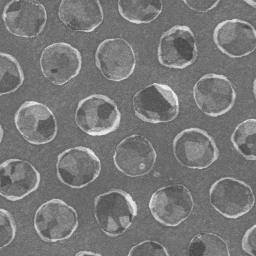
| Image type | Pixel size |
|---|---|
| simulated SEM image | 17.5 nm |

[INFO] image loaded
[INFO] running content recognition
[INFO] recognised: a regular array of raised bodies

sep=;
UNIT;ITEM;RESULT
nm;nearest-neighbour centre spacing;1010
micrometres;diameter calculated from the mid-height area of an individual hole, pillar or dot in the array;0.711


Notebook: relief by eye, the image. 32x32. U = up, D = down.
DUUUUDDDUUUUDDDUUUUUDDDUUUUDDDDD
DUUUUUDUUUUUUDDUUUUUDDDDDDDDDDDD
DUUUUUDDUUUUUDDDUUUDDDDDDDDDDDDD
DUUUUDDDDUUUDDDDDDDDDDDDDDDUUUUU
DDDUDDDDDDDDDDDDDDDDDUUUDDDUUUUU
DDDDDDDUDDDDDUUUDDDDUUUUDDDUUUUU
DDDDDUUUUUDDUUUUUDDDUUUUDDDDUUUD
UUDDDUUUUUDDUUUUUDDDUUUUDDDDDDDD
UUDDDUUUUUDDUUUUUDDDDDDDDDDDDDDD
UUUDDDUUUDDDDUUUDDDDDDDDDDDDDDDD
UUUDDDDUDDDDDDDDDDDUDDDDDUUUUDDD
UDDDDDDDDDDDDDDDDUUUUUDDUUUUUDDD
DDDDDDDDDDDUUDDDDUUUUUDDUUUUUDDD
DDDUUUDDDDUUUUUDDUUUUUDDDUUUUDDD
DDUUUUUDDUUUUUUDDDUUUUDDDDDDDDDD
DDUUUUUDDDUUUUDDDDDDDDDDDDDDDDUU
DDUUUUUDDDDUUDDDDDDDDDDUUDDDDUUU
DDDUUUDDDDDDDDDUUUDDDDUUUUDDDUUU
DDDDDDDDDDDDDDDUUUUDDDUUUUUDDDUU
DDDDDDDDUUUUDDUUUUUDDDUUUUUDDDDU
UUUUDDDUUUUUUDDUUUUDDDDUUUDDDDDD
UUUUUDDUUUUUDDDUUUUDDDDDDDDDDDDD
UUUUUDDDUUUUDDDDDDDDDDDDDDDUUDDD
UUUUDDDDDDDDDDDDDDDDUUUDDDUUUUUD
UUUDDDDDDDDDDUUUDDDUUUUUDDUUUUUU
DDDDDDUUDDDDUUUUUDDUUUUUDDUUUUUU
UDDDDUUUUDDDUUUUUDDUUUUUDDDDUUUD
UDDDUUUUUUDDUUUUDDDDUUUDDDDDDDDD
UUDDDUUUUDDDDUUUDDDDDDDDDDDDDDDD
UUDDDUUUUDDDDDDDDDDDDDDDUUUDDDDU
UDDDDDDDDDDDDDDDDUUUDDDDUUUUDDUU
DDDDDDDDDDDDDDDDUUUUUDDDUUUUUDDU